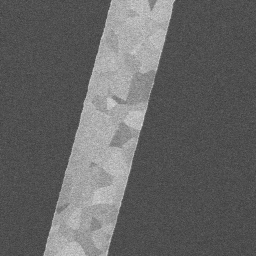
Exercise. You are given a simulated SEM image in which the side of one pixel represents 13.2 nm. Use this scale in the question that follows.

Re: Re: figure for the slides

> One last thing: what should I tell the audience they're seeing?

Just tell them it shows one or a few lines or trenches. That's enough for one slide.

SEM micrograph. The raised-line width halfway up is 0.808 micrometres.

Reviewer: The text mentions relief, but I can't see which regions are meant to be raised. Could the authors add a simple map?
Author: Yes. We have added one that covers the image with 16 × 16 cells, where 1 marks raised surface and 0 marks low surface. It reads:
0000000111100000
0000000111100000
0000001111000000
0000001111000000
0000001111000000
0000001110000000
0000011110000000
0000011110000000
0000011110000000
0000111100000000
0000111100000000
0000111100000000
0000111100000000
0001111000000000
0001111000000000
0001111000000000